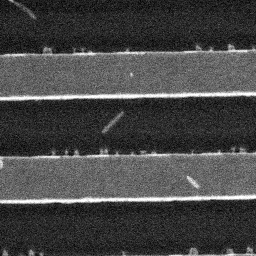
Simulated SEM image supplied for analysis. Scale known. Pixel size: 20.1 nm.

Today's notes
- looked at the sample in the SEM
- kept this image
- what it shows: lines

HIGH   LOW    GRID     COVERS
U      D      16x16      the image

DDDDDDDDDDDDDDDD
DDDDDDDDDDDDDDDD
DDDDDDDDDDDDDDDD
UUUUUUUUUUUUUUUU
UUUUUUUUUUUUUUUU
UUUUUUUUUUUUUUUU
DDDDDDDDDDDDDDDD
DDDDDDDDDDDDDDDD
DDDDDDDDDDDDDDDD
DDDDDDDDDDDDDDDD
UUUUUUUUUUUUUUUU
UUUUUUUUUUUUUUUU
UUUUUUUUUUDDDDDD
DDDDDDDDDDDDDDDD
DDDDDDDDDDDDDDDD
DDDDDDDDDDDDDDDD